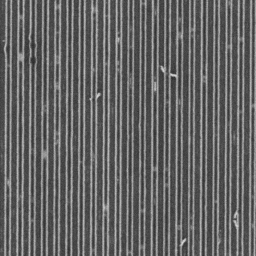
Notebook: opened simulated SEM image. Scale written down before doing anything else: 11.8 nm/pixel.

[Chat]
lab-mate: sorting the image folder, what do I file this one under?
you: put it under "parallel lines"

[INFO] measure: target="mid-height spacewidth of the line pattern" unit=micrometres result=0.0781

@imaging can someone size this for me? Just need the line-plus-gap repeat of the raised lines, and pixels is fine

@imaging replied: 12.2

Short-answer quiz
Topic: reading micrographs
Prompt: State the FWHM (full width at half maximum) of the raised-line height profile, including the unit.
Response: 0.0663 microns